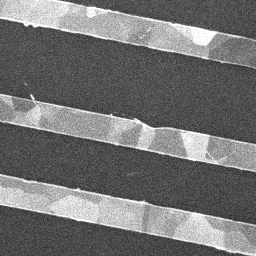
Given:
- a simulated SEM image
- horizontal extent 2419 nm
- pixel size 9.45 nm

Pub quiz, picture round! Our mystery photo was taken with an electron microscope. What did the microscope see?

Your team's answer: one or a few lines or trenches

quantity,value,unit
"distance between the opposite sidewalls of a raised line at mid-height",0.26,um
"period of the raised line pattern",843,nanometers